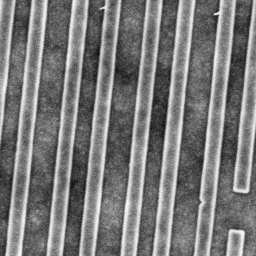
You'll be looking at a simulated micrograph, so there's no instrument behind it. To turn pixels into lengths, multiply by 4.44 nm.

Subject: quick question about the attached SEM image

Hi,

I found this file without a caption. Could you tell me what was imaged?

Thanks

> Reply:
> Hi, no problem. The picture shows parallel lines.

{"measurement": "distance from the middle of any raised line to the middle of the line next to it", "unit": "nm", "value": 165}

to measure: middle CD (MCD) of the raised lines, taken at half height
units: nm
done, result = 64